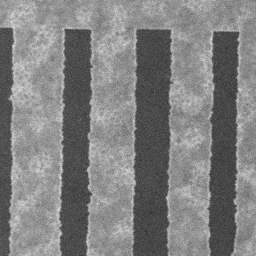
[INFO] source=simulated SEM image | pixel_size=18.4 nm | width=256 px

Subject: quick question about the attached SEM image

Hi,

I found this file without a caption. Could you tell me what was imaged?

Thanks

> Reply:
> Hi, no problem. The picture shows one or a few lines or trenches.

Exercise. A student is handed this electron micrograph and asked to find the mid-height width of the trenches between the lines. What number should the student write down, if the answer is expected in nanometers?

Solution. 531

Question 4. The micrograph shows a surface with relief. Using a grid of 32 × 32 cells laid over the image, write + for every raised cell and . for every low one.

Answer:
++++++++++++++++++++++++++++++++
++++++++++++++++++++++++++++++++
++++++++++++++++++++++++++++++++
.+++++++.+++++++++++++++++++++++
..++++++....+++++....++++++...++
..++++++...++++++....+++++....++
..++++++....+++++....+++++....++
..++++++...++++++.....++++....++
..++++++....+++++....++++++...++
..++++++....+++++....++++++...++
..++++++...++++++....++++++...++
..++++++....+++++....++++++...++
.+++++++...++++++....++++++...++
..++++++...++++++....+++++....++
..++++++...++++++....+++++....++
.+++++++...++++++....+++++....++
..++++++...++++++....+++++....++
..++++++...++++++....+++++....++
.+++++++...++++++....+++++....++
..++++++...++++++....+++++....++
..++++++...++++++....+++++....++
..++++++...++++++....+++++....++
.+++++++...++++++....+++++....++
..++++++...++++++....+++++....++
..+++++....++++++....+++++....++
.+++++++...++++++....+++++...+++
.++++++....++++++....+++++....++
.++++++....++++++....+++++...+++
.++++++....++++++....+++++....++
.++++++....++++++....+++++...+++
.++++++....++++++....+++++...+++
.++++++....++++++....+++++...+++